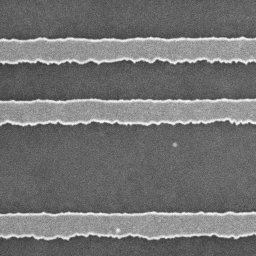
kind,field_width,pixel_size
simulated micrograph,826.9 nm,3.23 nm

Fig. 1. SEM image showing lines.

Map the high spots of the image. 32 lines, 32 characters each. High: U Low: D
DDDDDDDDDDDDDDDDDDDDDDDDDDDDDDDD
DDDDDDDDDDDDDDDDDDDDDDDDDDDDDDDD
DDDDDDDDDDDDDDDDDDDDDDDDDDDDDDDD
DDDDDDDDDDDDDDDDDDDDDDDDDDDDDDDD
DDDDDDDDDDDDDDDDDDDDDDDDDDDDDDDD
UUUUUUUUUUUUUUUUUUUUUUUUUUUUUUUU
UUUUUUUUUUUUUUUUUUUUUUUUUUUUUUUU
UUUUUUUUUUUUUUUUUUUUUUUUUUUUUUUU
DDDDDDDDDDDDDDDDDDDDDDDDDDDDDDDD
DDDDDDDDDDDDDDDDDDDDDDDDDDDDDDDD
DDDDDDDDDDDDDDDDDDDDDDDDDDDDDDDD
DDDDDDDDDDDDDDDDDDDDDDDDDDDDDDDD
DDDDUDDDDUUUUDDUUUUDDUUDUUUUUUUU
UUUUUUUUUUUUUUUUUUUUUUUUUUUUUUUU
UUUUUUUUUUUUUUUUUUUUUUUUUUUUUUUU
DDUUUDDDUUDDDDDUUUUDDDDDDDDDDDDD
DDDDDDDDDDDDDDDDDDDDDDDDDDDDDDDD
DDDDDDDDDDDDDDDDDDDDDDDDDDDDDDDD
DDDDDDDDDDDDDDDDDDDDDDDDDDDDDDDD
DDDDDDDDDDDDDDDDDDDDDDDDDDDDDDDD
DDDDDDDDDDDDDDDDDDDDDDDDDDDDDDDD
DDDDDDDDDDDDDDDDDDDDDDDDDDDDDDDD
DDDDDDDDDDDDDDDDDDDDDDDDDDDDDDDD
DDDDDDDDDDDDDDDDDDDDDDDDDDDDDDDD
DDDDDDDDDDDDDDDDDDDDDDDDDDDDDDDD
DDDDDDDDDDDDDDDDDDDDDDDDDDDDDDDD
DDDDDDDDDDDDDDDDDDDDDDDDDDDDDDDD
UUUUUUUUUUUUUUUUUUUUUUUUUUUUUUUU
UUUUUUUUUUUUUUUUUUUUUUUUUUUUUUUU
UUUUUUUUUDDDDUUUDUUUUUUUDDDUUUDD
DDDDDDDDDDDDDDDDDDDDDDDDDDDDDDDD
DDDDDDDDDDDDDDDDDDDDDDDDDDDDDDDD